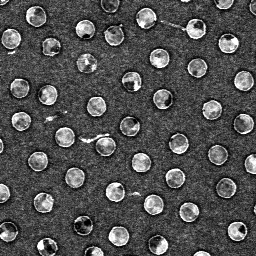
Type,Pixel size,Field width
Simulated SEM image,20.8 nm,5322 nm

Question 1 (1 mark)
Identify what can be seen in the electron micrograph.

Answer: a regular array of raised bodies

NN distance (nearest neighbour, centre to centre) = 738 nm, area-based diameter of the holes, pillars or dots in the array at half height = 386 nm